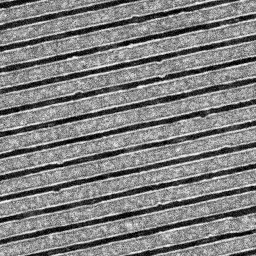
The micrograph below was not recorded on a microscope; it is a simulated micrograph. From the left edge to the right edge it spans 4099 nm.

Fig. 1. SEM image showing parallel lines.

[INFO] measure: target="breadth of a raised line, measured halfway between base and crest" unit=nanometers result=233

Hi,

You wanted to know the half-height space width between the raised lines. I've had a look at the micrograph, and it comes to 110 nm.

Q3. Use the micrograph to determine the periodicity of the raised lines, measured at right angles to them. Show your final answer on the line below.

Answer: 21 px